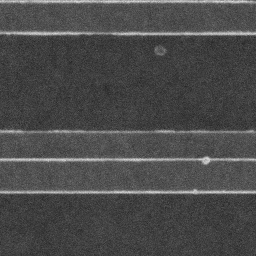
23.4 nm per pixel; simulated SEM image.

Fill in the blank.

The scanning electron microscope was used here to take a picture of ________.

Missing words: lines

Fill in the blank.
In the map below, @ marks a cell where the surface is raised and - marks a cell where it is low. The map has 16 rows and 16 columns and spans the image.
@@@@@@@@@@@@@@@@
@@@@@@@@@@@@@@@@
----------------
----------------
----------------
----------------
----------------
----------------
@@@@@@@@@@@@@@@@
@@@@@@@@@@@@@@@@
@@@@@@@@@@@@@@@@
@@@@@@@@@@@@@@@@
----------------
----------------
----------------
----------------